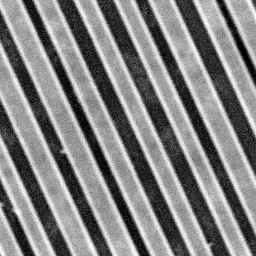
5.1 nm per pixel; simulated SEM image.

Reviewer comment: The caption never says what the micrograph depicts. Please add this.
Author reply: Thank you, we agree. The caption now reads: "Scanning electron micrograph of parallel lines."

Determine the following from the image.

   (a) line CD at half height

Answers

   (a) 90.3 nm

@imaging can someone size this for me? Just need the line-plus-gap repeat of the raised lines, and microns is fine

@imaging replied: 0.18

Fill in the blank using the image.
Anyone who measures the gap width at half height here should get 88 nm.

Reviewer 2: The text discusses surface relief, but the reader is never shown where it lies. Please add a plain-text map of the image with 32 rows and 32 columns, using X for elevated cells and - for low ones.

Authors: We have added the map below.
XXX--XX---XX---XX--XXX---XX-XXX-
XXX--XXX--XX---XX--XXX---XX--XXX
-XXX--XX---XX---XX--XXX---XX-XXX
-XXX--XX---XX---XX--XXX---XX--XX
--XX--XXX---XX---XX--XXX---XX-XX
--XXX--XX---XX---XX--XXX---XX--X
---XX--XXX--XXX--XXX--XXX--XXX-X
X--XXX--XX---XX---XX--XXX---XX--
X---XX--XXX--XXX--XX---XX---XXX-
XX--XXX--XX---XX---XX--XXX---XX-
XX--XXX--XXX--XX---XX---XX---XXX
XXX--XXX--XX---XX---XX--XXX---XX
XXX--XXX--XXX--XX---XX---XX---XX
-XXX--XXX--XX---XX---XX--XXX---X
-XXX--XXX--XX---XX---XX--XXX---X
--XX---XXX--XX---XX---XX--XXX---
--XXX--XXX--XX---XX---XX--XXX---
---XX---XX--XXX---XX---XX--XXX--
---XXX--XXX--XX---XX---XX--XXX--
X---XX---XX--XXX--XXX--XX---XX--
X---XXX--XXX--XX---XX---XX--XXX-
XX--XXX---XX--XXX--XXX--XX---XX-
XX---XXX--XXX--XX---XX---XX--XXX
-XX--XXX---XX--XXX--XXX--XX---XX
-XX---XXX--XXX--XX---XX---XX--XX
--XX--XXX--XXX--XXX--XX---XX--XX
--XX---XX---XXX--XX---XX---XX--X
X--XX--XXX--XXX--XX---XX---XX--X
X--XX---XX---XX--XXX---XX---XX--
X---XX--XXX--XXX--XX---XX---XX--
XX--XX---XX---XX--XXX--XXX--XXX-
XX--XX---XXX--XXX--XX---XX---XX-